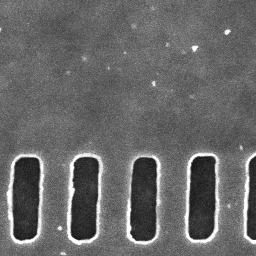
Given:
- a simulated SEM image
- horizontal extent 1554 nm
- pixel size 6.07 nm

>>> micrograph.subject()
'holes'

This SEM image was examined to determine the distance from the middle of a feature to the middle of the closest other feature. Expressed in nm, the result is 357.